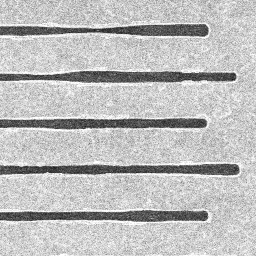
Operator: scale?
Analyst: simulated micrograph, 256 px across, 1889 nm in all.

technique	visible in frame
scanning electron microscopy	parallel lines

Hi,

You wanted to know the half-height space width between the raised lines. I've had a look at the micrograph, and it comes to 78.4 nanometers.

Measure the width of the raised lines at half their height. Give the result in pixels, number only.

36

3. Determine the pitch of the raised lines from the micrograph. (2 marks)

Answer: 341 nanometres